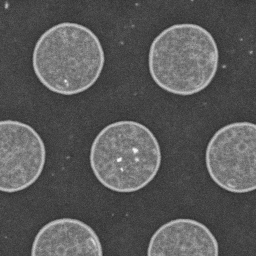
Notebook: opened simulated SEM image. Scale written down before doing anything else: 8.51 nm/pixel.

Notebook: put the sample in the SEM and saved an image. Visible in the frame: raised bodies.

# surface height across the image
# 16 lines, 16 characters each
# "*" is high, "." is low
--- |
................
................
...***....***...
..****...*****..
..****...****...
...**.....***...
................
................
**....****...***
***...****...***
***...****...***
**.....**.....**
................
................
...***....***...
..****...*****..